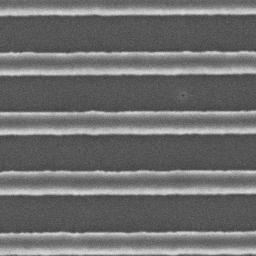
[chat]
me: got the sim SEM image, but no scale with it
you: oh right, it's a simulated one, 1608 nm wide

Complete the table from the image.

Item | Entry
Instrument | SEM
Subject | lines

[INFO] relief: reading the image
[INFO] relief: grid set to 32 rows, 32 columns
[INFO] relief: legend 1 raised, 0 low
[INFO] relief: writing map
11111111111111111111111111111111
11111111111111111111111111111110
00000000000000000000000000000000
00000000000000000000000000000000
00000000000000000000000000000000
00000000000000000000000000000000
00000000000000000000001101110011
11111111111111111111111111111111
11111111111111111111111111111111
00000000000000000000000000000000
00000000000000000000000000000000
00000000000000000000000000000000
00000000000000000000000000000000
00000000000000000000000000000000
11111111111111111111111111111111
11111111111111111111111111111111
11111111111111111111111111110010
00000000000000000000000000000000
00000000000000000000000000000000
00000000000000000000000000000000
00000000000000000000000000000000
01000111000010000111011111111111
11111111111111111111111111111111
11111111111111111111111111111111
00000000000000000000000000000000
00000000000000000000000000000000
00000000000000000000000000000000
00000000000000000000000000000000
00000000000000000000000000000000
11111111111111111111111111111111
11111111111111111111111111111111
11111111111111111111111111111111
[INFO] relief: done